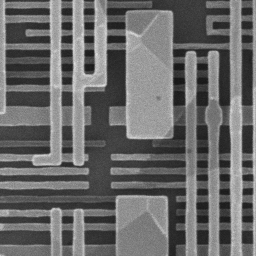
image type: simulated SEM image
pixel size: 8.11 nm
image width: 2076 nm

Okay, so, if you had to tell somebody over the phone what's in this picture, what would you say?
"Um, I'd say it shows wiring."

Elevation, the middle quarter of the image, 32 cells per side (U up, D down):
DDUUUDDDUUDDDDDDUUUUUUUUUUUDDDUU
DDUUUDDDUUDDDDDDUUUUUUUUUUUDDDUU
DDUUUDDDUUDDDDDDUUUUUUUUUUUDDDUU
DDUUUUUUUUDDDDDDUUUUUUUUUUUDDDUU
DDUUUUUUUUDDDDDDUUUUUUUUUUUDDDUU
DDUUUUDDDDDDDDDDUUUUUUUUUUUDDDDU
DDUUUDDDDDDDDDDDUUUUUUUUUUUDDDDU
DDUUUDDDDDDDDDDDUUUUUUUUUUUDDDDU
DDUUUDDDDDDDDDDDUUUUUUUUUUUDDDDU
DDUUUDDDDDDDDDDDUUUUUUUUUUUDDDDU
DDUUUDDDDDDDDDDDUUUUUUUUUUUDDDDU
DDUUUDDDDDDDDDDDUUUUUUUUUUUDDDDU
DDUUUDDDDDDDDDDDUUUUUUUUUUUDDDDU
DDUUUDDDDDDDDDDDUUUUUUUUUUUDDDDU
DDUUUDDDDDDDDDDDUUUUUUUUUUUDDDDU
DDUUUDDDDDDDDDDDUUUUUUUUUUUDDDDU
DDUUUDDDDDDDDDDDUUUUUUUUUUUDDDDU
DDUUUDDDDDDDDDDDUUUUUUUUUUUDDDDU
DDUUUDDDDDDDDDDDDDUUUUUUDDDDDDDU
DDUUUDDDDDDDDDDDDDDDDDDDDDDDDDDU
DDUUUDDDDDDDDDDDDDDDDDDDDDDDDDDU
DDUUUDDDDDDDDDDDDDDDDDDDDDDDDDDU
DDUUUDDDDDDDDDDDDDDDDDDDDDDDDDDU
DDUUUDDDDDDDDDDDDDDDDDDDDDDDDDDU
DDUUUDDDDDDDDDDDDDDDDDDDDDDDDDDU
DDDDDDDDDDDDDDDDDDDDDDDDDDDDDDDU
DDDDDDDDDDDDDDDDDDDDDDDDDDDDDDDU
DDDDDDDDDDDDDDDDDDDDDDDDDDDDDDDU
DDDDDDDDDDDDDDDDDDDDDDDDDDDDDDDU
DDDDDDDDDDDDDDDDDDDDDDDDDDDDDDDU
DDDDDDDDDDDDDDDDDDDDDDDDDDDDDDDU
DDDDDDDDDDDDDDDDDDDDDDDDDDDDDDDU